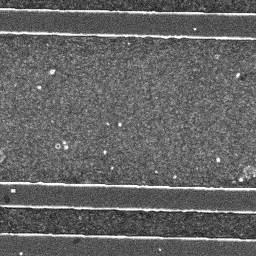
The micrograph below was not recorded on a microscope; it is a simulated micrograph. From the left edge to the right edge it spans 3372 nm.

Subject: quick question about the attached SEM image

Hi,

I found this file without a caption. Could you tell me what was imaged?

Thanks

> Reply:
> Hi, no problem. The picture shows lines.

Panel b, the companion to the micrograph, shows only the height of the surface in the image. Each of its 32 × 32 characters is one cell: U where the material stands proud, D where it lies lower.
DDDDDDDDDDDDDDDDDDDDDDDDDDDDDDDD
UUUUUUUUUUUUUUUUUUUUDDDDDDDDDDDD
UUUUUUUUUUUUUUUUUUUUUUUUUUUUUUUU
UUUUUUUUUUUUUUUUUUUUUUUUUUUUUUUU
DDDDDDDDDDDDDDDDDUUUUUUUUUUUUUUU
DDDDDDDDDDDDDDDDDDDDDDDDDDDDDDDD
DDDDDDDDDDDDDDDDDDDDDDDDDDDDDDDD
DDDDDDDDDDDDDDDDDDDDDDDDDDDDDDDD
DDDDDDDDDDDDDDDDDDDDDDDDDDDDDDDD
DDDDDDDDDDDDDDDDDDDDDDDDDDDDDDDD
DDDDDDDDDDDDDDDDDDDDDDDDDDDDDDDD
DDDDDDDDDDDDDDDDDDDDDDDDDDDDDDDD
DDDDDDDDDDDDDDDDDDDDDDDDDDDDDDDD
DDDDDDDDDDDDDDDDDDDDDDDDDDDDDDDD
DDDDDDDDDDDDDDDDDDDDDDDDDDDDDDDD
DDDDDDDDDDDDDDDDDDDDDDDDDDDDDDDD
DDDDDDDDDDDDDDDDDDDDDDDDDDDDDDDD
DDDDDDDDDDDDDDDDDDDDDDDDDDDDDDDD
DDDDDDDDDDDDDDDDDDDDDDDDDDDDDDDD
DDDDDDDDDDDDDDDDDDDDDDDDDDDDDDDD
DDDDDDDDDDDDDDDDDDDDDDDDDDDDDDDD
DDDDDDDDDDDDDDDDDDDDDDDDDDDDDDDD
DDDDDDDDDDDDDDDDDDDDDDDDDDDDDDDD
UUUUUUUUUUUUUUUUUUUUUUUUUUUDDDDD
UUUUUUUUUUUUUUUUUUUUUUUUUUUUUUUU
UUUUUUUUUUUUUUUUUUUUUUUUUUUUUUUU
DDDDDDDDDDDDDDDDDDDDDDDDDDDDDUUU
DDDDDDDDDDDDDDDDDDDDDDDDDDDDDDDD
DDDDDDDDDDDDDDDDDDDDDDDDDDDDDDDD
UUUUUUUUUUUDDDDDDDDDDDDDDDDDDDDD
UUUUUUUUUUUUUUUUUUUUUUUUUUUUUUUU
UUUUUUUUUUUUUUUUUUUUUUUUUUUUUUUU